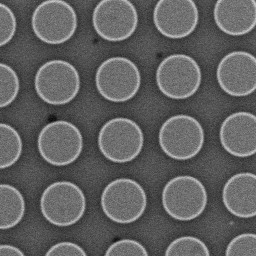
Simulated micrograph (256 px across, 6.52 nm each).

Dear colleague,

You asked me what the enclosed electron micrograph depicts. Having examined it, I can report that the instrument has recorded an array of small figures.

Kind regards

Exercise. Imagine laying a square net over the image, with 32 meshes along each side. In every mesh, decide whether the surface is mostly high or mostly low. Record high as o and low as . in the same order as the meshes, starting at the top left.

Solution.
.....ooo....oooo....oooo...ooooo
o...ooooo...ooooo..oooooo..ooooo
oo..ooooo...ooooo..oooooo..ooooo
oo..ooooo...ooooo...oooo....oooo
oo...oooo....ooo.....oo.........
................................
................................
..............oo.....ooo....oooo
o....oooo...ooooo...ooooo..ooooo
oo...ooooo..ooooo...ooooo..ooooo
oo..oooooo..ooooo...ooooo...oooo
oo...ooooo...oooo...oooo....ooo.
oo....ooo.....oo................
................................
......................o......ooo
......ooo....oooo....oooo...oooo
oo...ooooo...ooooo..ooooo...oooo
ooo..ooooo..oooooo..ooooo...oooo
ooo..ooooo...ooooo..ooooo...oooo
oo...ooooo...oooo....ooo......o.
o......o........................
................................
...............o......ooo....ooo
oo....oooo...ooooo...oooo...oooo
ooo..ooooo...ooooo..oooooo..oooo
ooo..oooooo..ooooo..oooooo..oooo
ooo..ooooo...ooooo...oooo....ooo
oo....oooo....ooo...............
o...............................
..............................oo
.......oo.....ooo....oooo....ooo
ooo...oooo...ooooo...ooooo..oooo